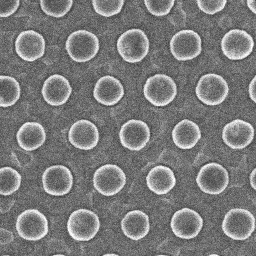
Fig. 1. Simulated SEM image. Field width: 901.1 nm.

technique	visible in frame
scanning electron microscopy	a regular array of raised bodies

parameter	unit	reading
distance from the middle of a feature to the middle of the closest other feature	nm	180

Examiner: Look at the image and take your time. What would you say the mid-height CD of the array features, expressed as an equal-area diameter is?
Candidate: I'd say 107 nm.